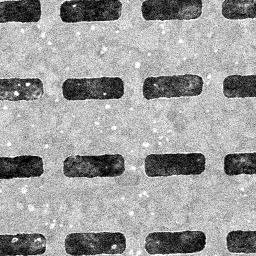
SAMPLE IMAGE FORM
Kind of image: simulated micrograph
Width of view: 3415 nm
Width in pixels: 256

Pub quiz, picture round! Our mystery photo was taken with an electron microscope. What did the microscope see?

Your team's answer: holes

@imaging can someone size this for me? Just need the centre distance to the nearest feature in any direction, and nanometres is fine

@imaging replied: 1040